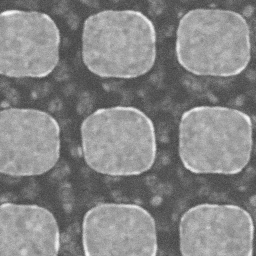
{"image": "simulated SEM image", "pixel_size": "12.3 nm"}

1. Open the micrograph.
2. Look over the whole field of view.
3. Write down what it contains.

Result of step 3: raised bodies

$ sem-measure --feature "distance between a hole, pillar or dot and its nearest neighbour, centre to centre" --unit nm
1180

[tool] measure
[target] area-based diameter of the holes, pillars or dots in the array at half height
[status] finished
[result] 898 nm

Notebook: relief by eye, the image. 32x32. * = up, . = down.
................................
...**........****.......*****...
******.....*******.....*******..
*******....********...*********.
*******...*********...*********.
*******...*********...*********.
*******...*********...*********.
*******...*********....********.
*******....********....*******..
.*..*........****...............
................................
................................
................................
..............**.........***....
******.....*******.....********.
*******...*********....********.
*******...*********....********.
*******...*********....********.
*******...*********...*********.
*******....********....********.
*******....********....********.
******......******.......*.***..
................................
................................
................................
................................
******.....*******.....********.
*******....********....********.
*******...*********....*********
*******...*********....********.
*******....********....********.
*******....********....********.